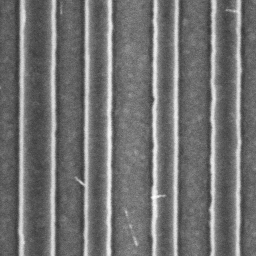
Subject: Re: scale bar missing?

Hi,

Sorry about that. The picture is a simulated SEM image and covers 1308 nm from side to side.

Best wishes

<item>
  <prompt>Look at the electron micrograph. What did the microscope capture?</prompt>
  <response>one or a few lines or trenches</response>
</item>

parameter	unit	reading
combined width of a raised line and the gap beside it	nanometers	321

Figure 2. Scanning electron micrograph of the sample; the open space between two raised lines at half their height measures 36.4 pixels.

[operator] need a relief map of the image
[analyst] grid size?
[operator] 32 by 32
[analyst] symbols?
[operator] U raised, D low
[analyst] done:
DDDUUUUDDDDUUUDDDDDUUUDDDDDUUUDD
DDDUUUUDDDDUUUDDDDDUUUDDDDDUUUDD
DDDUUUUDDDDUUUDDDDDUUUDDDDDUUUDD
DDDUUUUDDDDUUUDDDDDUUUDDDDDUUUDD
DDDUUUUDDDDUUUDDDDDUUUDDDDDUUUDD
DDDUUUUDDDDUUUDDDDDUUUDDDDDUUUDD
DDDUUUUDDDDUUUDDDDDUUUDDDDDUUUDD
DDDUUUUDDDDUUUDDDDDUUUDDDDDUUUDD
DDDUUUUDDDDUUUDDDDDUUUDDDDDUUUDD
DDDUUUUDDDDUUUDDDDDUUUDDDDDUUUDD
DDDUUUUDDDDUUUDDDDDUUUDDDDDUUUDD
DDDUUUUDDDDUUUDDDDDUUUDDDDDUUUDD
DDDUUUUDDDDUUUDDDDDUUUDDDDDUUUDD
DDDUUUUDDDDUUUDDDDDUUUDDDDDUUUDD
DDDUUUUDDDDUUUDDDDDUUUDDDDDUUUDD
DDDUUUUDDDDUUUDDDDDUUUDDDDDUUUDD
DDDUUUUDDDDUUUDDDDDUUUDDDDDUUUDD
DDDUUUUDDDDUUUDDDDDUUUDDDDDUUUDD
DDDUUUUDDDDUUUDDDDDUUUDDDDDUUUDD
DDDUUUUDDDDUUUDDDDDUUUDDDDUUUUDD
DDDUUUUDDDDUUUDDDDDUUUDDDDUUUUDD
DDDUUUUDDDDUUUDDDDDUUUDDDDDUUUDD
DDDUUUUDDDDUUUDDDDDUUUDDDDDUUUDD
DDDUUUUDDDDUUUDDDDDUUUDDDDDUUUDD
DDDUUUUDDDDUUUDDDDDUUUDDDDDUUUDD
DDDUUUUDDDDUUUDDDDDUUUDDDDDUUUDD
DDDUUUUDDDDUUUDDDDDUUUDDDDUUUUDD
DDDUUUUDDDDUUUDDDDDUUUDDDDDUUUDD
DDDUUUUDDDDUUUDDDDDUUUDDDDDUUUDD
DDDUUUUDDDDUUUDDDDDUUUDDDDDUUUDD
DDDUUUUDDDDUUUDDDDDUUUDDDDDUUUDD
DDDUUUUDDDDUUUDDDDDUUUDDDDDUUUDD